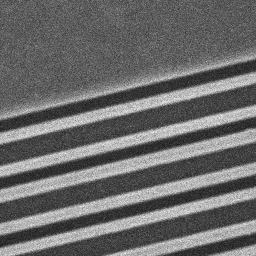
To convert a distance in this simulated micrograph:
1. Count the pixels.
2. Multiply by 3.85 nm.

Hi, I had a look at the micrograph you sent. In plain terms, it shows parallel lines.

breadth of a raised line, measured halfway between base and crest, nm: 42.1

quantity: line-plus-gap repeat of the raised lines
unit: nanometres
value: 109